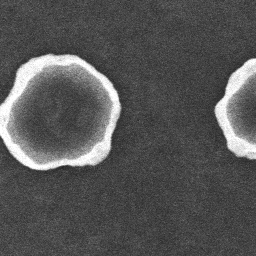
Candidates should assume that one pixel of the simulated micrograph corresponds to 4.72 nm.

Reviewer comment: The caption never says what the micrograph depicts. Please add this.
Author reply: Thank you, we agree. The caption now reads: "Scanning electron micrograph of raised bodies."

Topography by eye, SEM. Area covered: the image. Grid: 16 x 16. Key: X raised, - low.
----------------
----------------
----------------
----------------
--XXXX---------X
-XXXXXX-------XX
XXXXXXX-------XX
XXXXXXX-------XX
XXXXXXX-------XX
-XXXXX----------
----------------
----------------
----------------
----------------
----------------
----------------